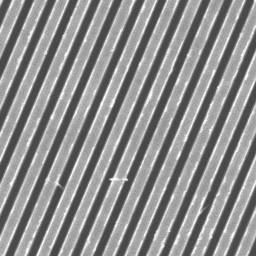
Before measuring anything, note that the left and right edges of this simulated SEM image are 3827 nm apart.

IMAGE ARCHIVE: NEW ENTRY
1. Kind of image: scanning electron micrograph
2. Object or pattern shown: parallel lines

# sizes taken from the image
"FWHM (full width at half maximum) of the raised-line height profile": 184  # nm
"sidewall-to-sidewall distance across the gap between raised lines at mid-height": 8.52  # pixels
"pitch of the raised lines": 0.304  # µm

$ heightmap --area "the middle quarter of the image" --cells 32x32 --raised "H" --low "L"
LLHHHLLLHHHLLHHHLLLHHHLLHHHLLLHH
LLHHHLLHHHLLLHHHLLHHHLLLHHHLLHHH
LHHHHLLHHHLLHHHHLLHHHLLHHHHLLHHH
LHHHLLHHHLLLHHHLLHHHHLLHHHLLLHHH
HHHHLLHHHLLHHHHLLHHHLLHHHHLLHHHL
HHHLLLHHHLLHHHLLHHHHLLHHHLLHHHHL
HHHLLHHHLLLHHHLLHHHLLLHHHLLHHHLL
HHLLLHHHLLHHHLLLHHHLLHHHLLLHHHLL
HHLLHHHLLLHHHLLHHHLLLHHHLLHHHLLL
HHLLHHHLLHHHHLLHHHLLHHHHLLHHHLLH
HLLLHHHLLHHHLLHHHHLLHHHLLHHHHLLH
HLLHHHLLHHHHLLHHHLLLHHHLLHHHLLLH
LLLHHHLLHHHLLHHHHLLHHHLLLHHHLLHH
LLHHHLLLHHHLLHHHLLLHHHLLHHHLLLHH
LLHHHLLHHHLLLHHHLLHHHHLLHHHLLHHH
LHHHLLLHHHLLHHHLLLHHHLLHHHLLLHHH
LHHHLLHHHHLLHHHLLHHHHLLHHHLLHHHH
LHHHLLHHHLLHHHHLLHHHLLHHHHLLHHHL
HHHLLLHHHLLHHHLLLHHHLLHHHLLLHHHL
HHHLLHHHLLHHHHLLHHHLLLHHHLLHHHLL
HHLLLHHHLLHHHLLLHHHLLHHHLLLHHHLL
HHLLHHHLLLHHHLLHHHHLLHHHLLHHHHLL
HLLLHHHLLHHHLLLHHHLLHHHLLLHHHLLL
HLLHHHHLLHHHLLHHHHLLHHHLLHHHHLLH
HLLHHHLLHHHHLLHHHLLLHHHLLHHHLLLH
LLLHHHLLHHHLLLHHHLLHHHLLLHHHLLHH
LLHHHLLLHHHLLHHHLLLHHHLLHHHLLLHH
LLHHHLLHHHLLLHHHLLHHHLLLHHHLLHHH
LHHHHLLHHHLLHHHHLLHHHLLHHHHLLHHH
LHHHLLHHHLLLHHHLLHHHHLLHHHLLLHHH
HHHHLLHHHLLHHHHLLHHHLLHHHHLLHHHL
HHHLLHHHHLLHHHLLHHHHLLHHHLLLHHHL